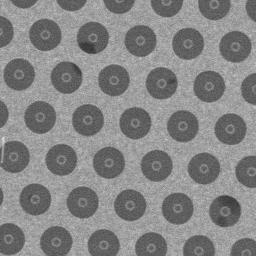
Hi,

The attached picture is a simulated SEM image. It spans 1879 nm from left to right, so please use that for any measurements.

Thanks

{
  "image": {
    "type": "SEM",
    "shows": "an array of small figures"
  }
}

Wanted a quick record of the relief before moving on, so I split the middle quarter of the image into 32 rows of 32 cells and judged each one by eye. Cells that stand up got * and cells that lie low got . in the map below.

....******.....*********.*******
....*****.......******.....*****
.....****.......*****.......****
*....***....*....***........****
.....***....*....***....*....***
....*****.......****....*....***
...******.......****........****
..********.....******.......****
**********************....******
********************************
****....************************
***......******.....*********.**
**........****.......******.....
**...**...****........****......
**...**...****...**...****......
**........****...*....****...**.
***......*****........****...*..
****....*******......*****......
****************....*******.....
****************************...*
..******************************
...******.....********...*******
...*****.......*****......******
...****........****........*****
....***...**...****........****.
...****....*...****...**...****.
...****........****........****.
..******......******.......****.
*********....*******......******
***********************.********
****.***************************
**.....********...**************